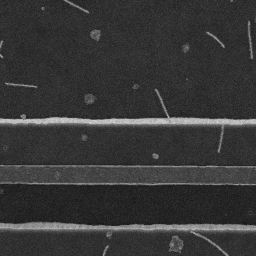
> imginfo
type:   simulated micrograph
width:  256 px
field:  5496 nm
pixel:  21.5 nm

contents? lines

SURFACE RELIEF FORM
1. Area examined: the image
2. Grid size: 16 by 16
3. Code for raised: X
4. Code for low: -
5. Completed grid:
----------------
----------------
----------------
----------------
----------------
----------------
----------------
----------------
XXXXXXXXXXXXXXXX
XXXXXXXXXXXXXXXX
XXXXXXXXXXXXXXXX
----------------
----------------
----------------
XXXXXXXXXXXXXXXX
XXXXXXXXXXXXXXXX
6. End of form